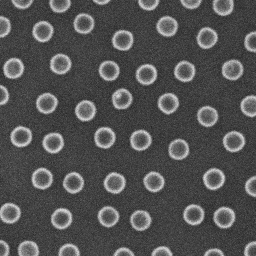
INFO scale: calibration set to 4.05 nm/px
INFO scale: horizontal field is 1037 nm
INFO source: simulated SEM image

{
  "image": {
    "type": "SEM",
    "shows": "a regular array of raised bodies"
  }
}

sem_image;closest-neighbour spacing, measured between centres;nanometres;144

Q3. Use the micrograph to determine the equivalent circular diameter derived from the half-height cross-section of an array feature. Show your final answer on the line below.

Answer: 78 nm